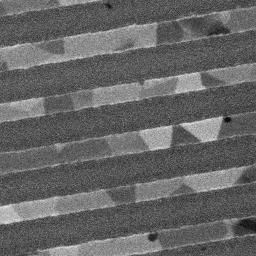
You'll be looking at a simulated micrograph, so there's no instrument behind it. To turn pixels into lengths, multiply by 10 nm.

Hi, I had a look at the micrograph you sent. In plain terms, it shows lines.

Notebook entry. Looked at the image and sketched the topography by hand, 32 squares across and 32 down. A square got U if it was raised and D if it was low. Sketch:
UUUUUUUUUDDDDDDDDDDDDDDDDDDDDDDD
UUUDDDDDDDDDDDDDDDDDDDDDDDDDUUUU
DDDDDDDDDDDDDDDDDDDDDDUUUUUUUUUU
DDDDDDDDDDDDDDDUUUUUUUUUUUUUUUUU
DDDDDDDDDUUUUUUUUUUUUUUUUUUDDDDD
DDDUUUUUUUUUUUUUUUUUUDDDDDDDDDDD
UUUUUUUUUUUUUUUDDDDDDDDDDDDDDDDD
UUUUUUUUDDDDDDDDDDDDDDDDDDDDDDDD
UUUDDDDDDDDDDDDDDDDDDDDDDDDDUUUU
DDDDDDDDDDDDDDDDDDDDDDUUUUUUUUUU
DDDDDDDDDDDDDDDDUUUUUUUUUUUUUDDD
DDDDDDDDDDUUUUUUUUUUUUUDDDDDDDDD
DDDUUUUUUUUUUUUUUDDDDDDDDDDDDDDD
UUUUUUUUUUUDDDDDDDDDDDDDDDDDDDDD
UUUUUDDDDDDDDDDDDDDDDDDDDDDDDUUU
DDDDDDDDDDDDDDDDDDDDDDDUUUUUUUUU
DDDDDDDDDDDDDDDDDUUUUUUUUUUUUUUU
DDDDDDDDDDUUUUUUUUUUUUUUUUUDDDDD
DDDDDUUUUUUUUUUUUUUUUDDDDDDDDDDD
UUUUUUUUUUUUUUDDDDDDDDDDDDDDDDDD
UUUUUUUUDDDDDDDDDDDDDDDDDDDDDDDD
UUDDDDDDDDDDDDDDDDDDDDDDDDDUUUUU
DDDDDDDDDDDDDDDDDDDDUUUUUUUUUUUU
DDDDDDDDDDDDDDUUUUUUUUUUUUUUDDDD
DDDDDDDDUUUUUUUUUUUUUDDDDDDDDDDD
DDUUUUUUUUUUUUUUDDDDDDDDDDDDDDDD
UUUUUUUUUDDDDDDDDDDDDDDDDDDDDDDD
UUUDDDDDDDDDDDDDDDDDDDDDDDDDUUUU
DDDDDDDDDDDDDDDDDDDDDDDUUUUUUUUU
DDDDDDDDDDDDDDDDUUUUUUUUUUUUUUUD
DDDDDDDDDDUUUUUUUUUUUUUUUDDDDDDD
DDDDUUUUUUUUUUUUUUUDDDDDDDDDDDDD